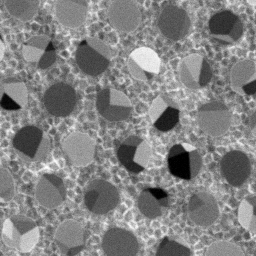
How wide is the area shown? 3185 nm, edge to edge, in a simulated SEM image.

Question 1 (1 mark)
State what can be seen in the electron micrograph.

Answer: a regular array of raised bodies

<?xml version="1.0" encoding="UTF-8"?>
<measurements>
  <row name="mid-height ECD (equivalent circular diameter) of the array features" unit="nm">438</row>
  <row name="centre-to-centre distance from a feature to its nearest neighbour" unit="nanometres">634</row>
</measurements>